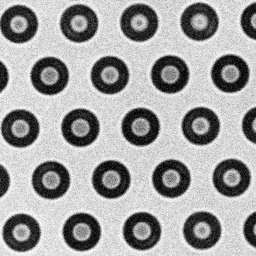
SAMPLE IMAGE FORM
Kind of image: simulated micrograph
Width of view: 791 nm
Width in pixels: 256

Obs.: an array of small figures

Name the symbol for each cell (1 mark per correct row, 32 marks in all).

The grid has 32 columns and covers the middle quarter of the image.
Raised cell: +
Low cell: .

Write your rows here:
.++++++.........++++++.........+
.++++++...+++...++++++...+++...+
.+++++....+++....+++++..++++...+
.+++++....+++...++++++...+++...+
.++++++...+.....++++++...+++...+
.++++++.........+++++++.......++
++++++++.......++++++++.......++
++++++++++...++++++++++++...++++
++++++++++++++++++++++++++++++++
++++++++++++++++++++++++++++++++
++++++++++++++++++++++++++++++++
++....++++++++++......+++++++++.
+.......+++++++........+++++++..
.........++++++.........++++++..
...+++...+++++...++++...+++++...
..++++...+++++...++++...+++++...
..++++...+++++...++++...+++++...
..++++...++++++...++....++++++..
........+++++++........+++++++..
+......+++++++++......+++++++++.
++....++++++++++++...+++++++++++
++++++++++++++++++++++++++++++++
++++++++++++++++++++++++++++++++
++++++++++++++++++++++++++++++++
+++++++++.....++++++++++......++
++++++++.......++++++++........+
.++++++.........++++++.........+
..+++++...+++....+++++...+++....
..+++++...++++...+++++...++++...
..+++++...++++...+++++...++++...
..+++++...+++...++++++....++....
.+++++++........+++++++........+